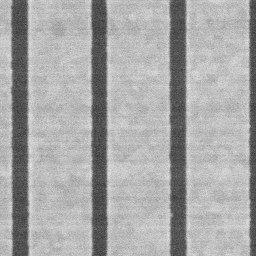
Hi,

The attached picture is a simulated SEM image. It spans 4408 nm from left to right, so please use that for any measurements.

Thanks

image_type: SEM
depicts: lines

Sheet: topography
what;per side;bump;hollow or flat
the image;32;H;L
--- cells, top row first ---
HLLLHHHHHHHLLHHHHHHHHLLHHHHHHHHL
HLLLHHHHHHHLLHHHHHHHHLLHHHHHHHHL
HLLLHHHHHHHLLHHHHHHHHLLHHHHHHHHL
HLLLHHHHHHHLLHHHHHHHHLLHHHHHHHHL
HLLLHHHHHHHLLHHHHHHHHLLHHHHHHHHL
HLLLHHHHHHHLLHHHHHHHHLLHHHHHHHHL
HLLLHHHHHHHLLHHHHHHHHLLHHHHHHHHL
HLLLHHHHHHHLLHHHHHHHHLLHHHHHHHHL
HLLLHHHHHHHLLHHHHHHHHLLHHHHHHHHL
HLLLHHHHHHHLLLHHHHHHHLLHHHHHHHHL
HLLLHHHHHHHLLHHHHHHHHLLHHHHHHHHL
HLLLHHHHHHHLLLHHHHHHHLLHHHHHHHHL
HLLLHHHHHHHLLHHHHHHHHLLHHHHHHHHL
HLLLHHHHHHHLLLHHHHHHHLLHHHHHHHHL
HLLLHHHHHHHLLLHHHHHHHLLHHHHHHHHL
HLLLHHHHHHHLLLHHHHHHHLLHHHHHHHHL
HLLLHHHHHHHLLLHHHHHHHLLHHHHHHHHL
HLLLHHHHHHHLLLHHHHHHHLLHHHHHHHHL
HLLLHHHHHHHLLLHHHHHHHLLHHHHHHHHL
HLLLHHHHHHHLLHHHHHHHHLLHHHHHHHHL
HLLLHHHHHHHLLLHHHHHHHLLHHHHHHHHL
HLLLHHHHHHHLLLHHHHHHHLLHHHHHHHHL
HLLLHHHHHHHLLHHHHHHHHLLHHHHHHHHL
HLLLHHHHHHHLLLHHHHHHHLLHHHHHHHHL
HLLLHHHHHHHLLLHHHHHHHLLHHHHHHHHL
HLLLHHHHHHHLLLHHHHHHHLLHHHHHHHHL
HLLLHHHHHHHLLLHHHHHHHLLHHHHHHHHL
HLLLHHHHHHHLLLHHHHHHHLLHHHHHHHHL
HLLLHHHHHHHLLLHHHHHHHLLHHHHHHHHL
HLLLHHHHHHHLLLHHHHHHHLLHHHHHHHHL
HLLLHHHHHHHLLLHHHHHHHLLHHHHHHHHL
HLLLHHHHHHHLLLHHHHHHHLLHHHHHHHHL